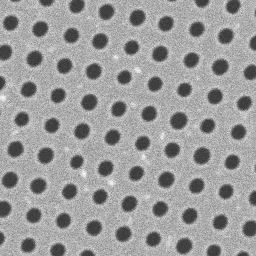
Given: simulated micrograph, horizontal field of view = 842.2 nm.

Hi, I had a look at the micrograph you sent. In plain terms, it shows a regular array of holes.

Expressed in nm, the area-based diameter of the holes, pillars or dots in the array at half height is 51.7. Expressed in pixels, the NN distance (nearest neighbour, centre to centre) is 30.